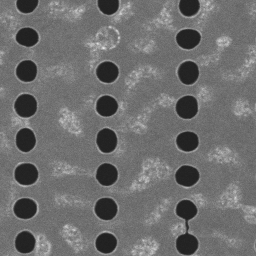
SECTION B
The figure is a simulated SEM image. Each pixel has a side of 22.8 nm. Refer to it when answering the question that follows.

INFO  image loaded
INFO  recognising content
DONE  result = a regular array of holes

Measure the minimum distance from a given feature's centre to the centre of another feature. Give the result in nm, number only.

780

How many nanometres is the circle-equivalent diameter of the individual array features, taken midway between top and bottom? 513